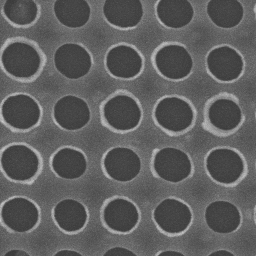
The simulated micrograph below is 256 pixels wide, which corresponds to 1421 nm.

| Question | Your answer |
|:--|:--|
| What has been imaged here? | a regular array of holes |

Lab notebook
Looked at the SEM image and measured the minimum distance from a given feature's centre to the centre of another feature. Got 280 nm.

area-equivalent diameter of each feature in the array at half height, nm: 198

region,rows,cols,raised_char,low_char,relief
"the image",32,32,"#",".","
#...###....##.....##....##....##
#....##....##.....##....##....##
#...###....##.....##....##....##
###############.############.###
################################
#..#####..######################
.....##....###...###...###....##
.....##....##.....#.....##....##
#....##....##.....##....##....##
##..####..####...####..####...##
################################
################################
#...###...####...###...####..###
.....##....##....###....##....##
.....##....##.....#.....##....##
#...###....###...###....###...##
################################
################################
#...##########..####..##########
.....##...###....##....###....##
.....##....##.....#.....##....##
#....##....##....###....##....##
##.############.#####..####...##
################################
################################
#...###...####...###...###...###
.....##....##....##.....##....##
.....##....##....##.....##....##
#...####..####...###...###....##
################################
################################
#..####...###....###..#####..###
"